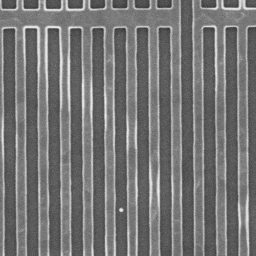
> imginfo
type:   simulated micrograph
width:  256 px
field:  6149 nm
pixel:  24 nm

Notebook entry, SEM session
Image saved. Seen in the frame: groups of lines, slits or small figures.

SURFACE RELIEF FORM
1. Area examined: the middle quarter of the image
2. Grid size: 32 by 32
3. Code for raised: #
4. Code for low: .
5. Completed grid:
#....##...##....##...##....##...
#....##...##....##...###...##...
#....##...##....##...###...##...
#....##...##....##...##....##...
#....##...##....##...###...##...
#....##...##....##...###...##...
#....##...##....##...###...##...
#....##...##....##...##....##...
#....##...##....##...###...##...
#....##...##....##...###...##...
#....##...##....##...###...##...
#....##...##....##...###...##...
#....##...##....##...###...##...
##...##...##....##...###...##...
##...##...##....##...###...##...
#....##...##....##...###...##...
#....##...##....##...###...##...
#....##...##....##...###...##...
#....##...##....##...###...##...
##...##...##....##...###...##...
##...##...##....##...###...##...
##...##...##....##...###...##...
#....##...##....##...###...##...
#....##...###...##...###...##...
##...##...###...##....##...##...
##...##...###...##....##...##...
##...##...##....##....##...##...
##...##...##....##....##...##...
##...##...##....##....##...##...
##...##...##....##....##...##...
##...##...##....##....#....##...
##...##...###...##....#....##...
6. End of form